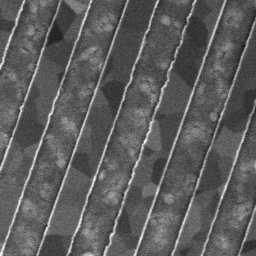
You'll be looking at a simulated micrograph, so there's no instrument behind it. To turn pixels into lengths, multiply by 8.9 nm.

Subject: one or a few lines or trenches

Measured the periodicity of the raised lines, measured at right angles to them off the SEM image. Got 563 nm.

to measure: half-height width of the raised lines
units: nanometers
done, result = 254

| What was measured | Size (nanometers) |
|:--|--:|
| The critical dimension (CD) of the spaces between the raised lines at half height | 306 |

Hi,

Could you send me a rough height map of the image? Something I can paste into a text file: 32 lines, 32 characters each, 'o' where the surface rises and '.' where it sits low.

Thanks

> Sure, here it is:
ooo....oooo.....oooo....oooo....
oo.....oooo....oooo.....oooo....
oo.....oooo....oooo....oooo.....
oo....oooo.....oooo....oooo.....
o.....oooo....oooo.....oooo....o
o.....ooo.....oooo.....ooo.....o
o....oooo.....oooo....oooo....oo
.....oooo....oooo.....ooo.....oo
.....ooo.....oooo....oooo.....oo
....oooo.....ooo.....oooo....ooo
....oooo....oooo.....ooo.....ooo
...oooo.....oooo....oooo.....ooo
...oooo.....ooo.....oooo....oooo
...oooo....oooo.....ooo.....oooo
..oooo.....oooo....oooo.....ooo.
..oooo....oooo.....oooo....oooo.
..oooo....oooo.....ooo.....oooo.
.oooo.....oooo....oooo.....ooo..
.oooo....oooo.....oooo....oooo..
.ooo.....oooo....oooo.....oooo..
oooo.....oooo....oooo.....ooo...
oooo....oooo.....oooo....oooo...
ooo.....oooo....oooo.....oooo...
ooo.....ooo.....oooo....oooo....
ooo....oooo.....ooo.....oooo....
oo.....oooo....oooo.....ooo.....
oo.....ooo.....oooo....oooo.....
oo....oooo.....ooo.....oooo....o
o.....oooo....oooo.....ooo.....o
o....oooo.....oooo....oooo.....o
o....oooo.....ooo.....oooo....oo
.....oooo....oooo.....ooo.....oo